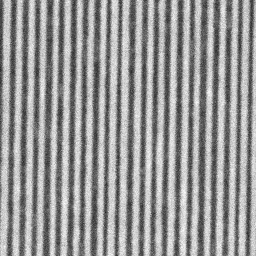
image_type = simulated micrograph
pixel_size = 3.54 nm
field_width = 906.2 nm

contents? parallel lines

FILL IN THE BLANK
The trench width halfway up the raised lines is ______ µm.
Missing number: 0.0244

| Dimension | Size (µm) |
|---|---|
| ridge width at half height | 0.0173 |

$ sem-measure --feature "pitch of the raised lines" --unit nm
42.3